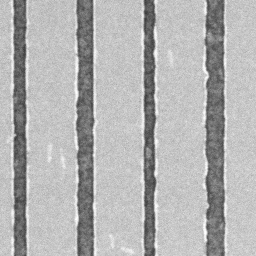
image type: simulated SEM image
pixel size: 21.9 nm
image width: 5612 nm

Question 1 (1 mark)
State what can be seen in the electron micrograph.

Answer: one or a few lines or trenches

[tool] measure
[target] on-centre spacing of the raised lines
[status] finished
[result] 1410 nm